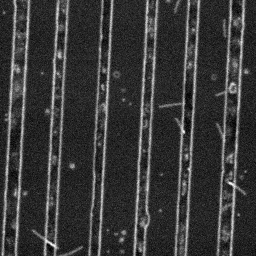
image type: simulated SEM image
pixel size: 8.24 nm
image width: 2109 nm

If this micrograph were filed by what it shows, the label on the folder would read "parallel lines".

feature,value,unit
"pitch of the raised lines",352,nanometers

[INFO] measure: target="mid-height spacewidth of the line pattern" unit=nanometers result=72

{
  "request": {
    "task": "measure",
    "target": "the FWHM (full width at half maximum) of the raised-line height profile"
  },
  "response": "270 nm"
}